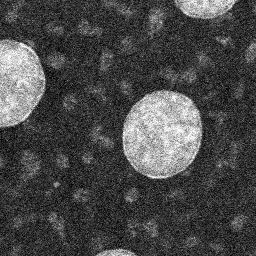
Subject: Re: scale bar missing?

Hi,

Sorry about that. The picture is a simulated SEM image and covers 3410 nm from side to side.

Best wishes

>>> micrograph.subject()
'holes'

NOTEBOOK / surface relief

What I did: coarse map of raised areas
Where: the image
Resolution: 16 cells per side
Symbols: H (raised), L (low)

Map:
HHHHHHHHHHHLLLHH
HHHHHHHHHHHHHHHH
HHHHHHHHHHHHHHHH
LLHHHHHHHHHHHHHH
LLLHHHHHHHHHHHHH
LLLHHHHHHHHHHHHH
LLHHHHHHHLLLHHHH
LHHHHHHHLLLLHHHH
HHHHHHHHLLLLLHHH
HHHHHHHHLLLLHHHH
HHHHHHHHHLLHHHHH
HHHHHHHHHHHHHHHH
HHHHHHHHHHHHHHHH
HHHHHHHHHHHHHHHH
HHHHHHHHHHHHHHHH
HHHHHHHHHHHHHHHH